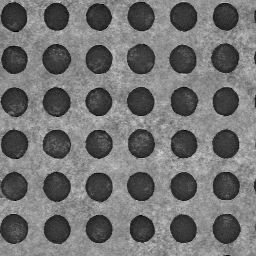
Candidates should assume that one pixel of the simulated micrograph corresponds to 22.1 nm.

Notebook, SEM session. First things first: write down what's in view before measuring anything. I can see a regular array of holes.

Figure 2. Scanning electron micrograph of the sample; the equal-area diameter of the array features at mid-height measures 622 nm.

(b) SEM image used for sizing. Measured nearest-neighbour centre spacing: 928 nanometres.